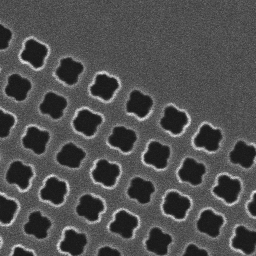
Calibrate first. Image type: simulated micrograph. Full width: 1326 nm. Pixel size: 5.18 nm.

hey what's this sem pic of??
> a regular array of holes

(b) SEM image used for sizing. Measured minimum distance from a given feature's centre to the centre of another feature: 197 nm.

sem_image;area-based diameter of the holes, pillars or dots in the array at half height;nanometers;126